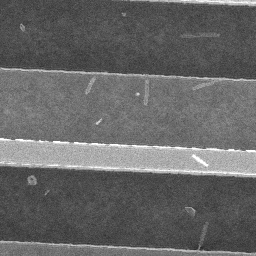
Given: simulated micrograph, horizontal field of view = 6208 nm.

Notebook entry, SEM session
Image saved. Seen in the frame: lines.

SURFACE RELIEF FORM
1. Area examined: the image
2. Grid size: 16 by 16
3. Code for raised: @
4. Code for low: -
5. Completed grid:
----------------
----------------
----------------
----------------
@@@@@-----------
@@@@@@@@@@@@@@@@
@@@@@@@@@@@@@@@@
@@@@@@@@@@@@@@@@
@@@@@@@@@@@@@@@@
@@@@@@@@@@@@@@@@
------@@@@@@@@@@
----------------
----------------
----------------
----------------
@@@@@@@@--------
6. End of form